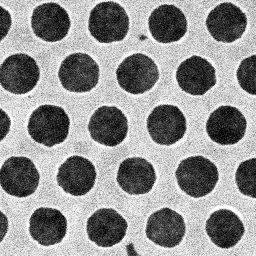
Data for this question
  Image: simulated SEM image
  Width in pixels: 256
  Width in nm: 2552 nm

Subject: a regular array of holes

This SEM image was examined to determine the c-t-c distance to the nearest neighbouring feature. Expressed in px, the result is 58.2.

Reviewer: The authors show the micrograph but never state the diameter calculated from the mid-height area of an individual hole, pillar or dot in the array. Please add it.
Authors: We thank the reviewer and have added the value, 408 nanometres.